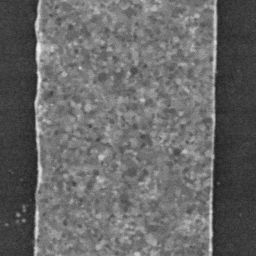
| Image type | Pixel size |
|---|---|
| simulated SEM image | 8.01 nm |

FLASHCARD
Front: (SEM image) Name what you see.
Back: one or a few lines or trenches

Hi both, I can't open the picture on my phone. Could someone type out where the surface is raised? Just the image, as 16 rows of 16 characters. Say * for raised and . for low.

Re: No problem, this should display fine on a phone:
..***********...
..***********...
..***********...
..***********...
..***********...
..***********...
..***********...
..***********...
..***********...
..***********...
..***********...
..***********...
..***********...
..***********...
..***********...
..***********...